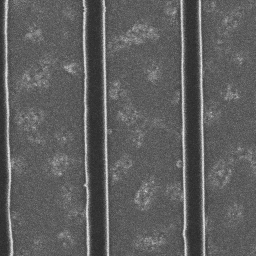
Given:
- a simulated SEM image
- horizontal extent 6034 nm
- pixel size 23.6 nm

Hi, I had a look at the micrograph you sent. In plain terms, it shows one or a few lines or trenches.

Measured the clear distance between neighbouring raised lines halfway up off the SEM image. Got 1840 nanometers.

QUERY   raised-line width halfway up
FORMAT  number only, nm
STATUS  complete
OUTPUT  458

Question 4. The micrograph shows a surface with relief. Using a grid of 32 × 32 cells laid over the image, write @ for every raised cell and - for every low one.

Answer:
@---------@@@----------@@-------
@----------@@----------@@-------
@----------@@----------@@-------
@----------@@----------@@-------
@----------@@----------@@-------
@----------@@----------@@-------
@----------@@----------@@-------
@----------@@----------@@-------
@----------@@----------@@-------
@----------@@----------@@-------
@----------@@----------@@-------
@----------@@----------@@-------
@----------@@----------@@-------
@----------@@----------@@-------
@----------@@----------@@-------
@----------@@----------@@-------
@----------@@----------@@-------
@----------@@----------@@-------
@----------@@----------@@-------
@----------@@----------@@-------
@----------@@----------@@-------
@----------@@----------@@-------
@----------@@----------@@-------
@----------@@----------@@-------
@----------@@----------@@-------
@----------@@----------@@-------
@----------@@----------@@-------
@----------@@----------@@-------
@----------@@----------@@-------
@----------@@@---------@@-------
@----------@@----------@@-------
@@---------@@----------@@-------